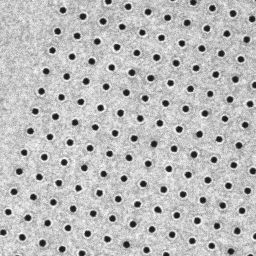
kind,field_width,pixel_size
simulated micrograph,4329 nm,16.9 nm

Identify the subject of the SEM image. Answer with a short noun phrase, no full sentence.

a regular array of holes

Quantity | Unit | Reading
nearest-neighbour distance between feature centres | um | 0.34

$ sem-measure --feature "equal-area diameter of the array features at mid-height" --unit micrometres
0.124